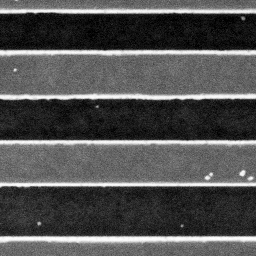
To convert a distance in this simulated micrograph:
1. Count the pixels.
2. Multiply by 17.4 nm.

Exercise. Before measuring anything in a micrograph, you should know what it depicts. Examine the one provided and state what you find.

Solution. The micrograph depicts lines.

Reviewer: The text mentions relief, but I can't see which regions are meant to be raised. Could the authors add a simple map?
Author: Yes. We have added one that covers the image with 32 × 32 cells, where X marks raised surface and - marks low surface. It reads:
XXXXXXXXXXXXXXXXXXXXXXXXXXXXXXXX
X-------XX-XXXXX-X-------XXXXXX-
--------------------------------
--------------------------------
--------------------------------
--------------------------------
XXXXXXXXXXXXXXXXXXXXXXXXXXXXXXXX
XXXXXXXXXXXXXXXXXXXXXXXXXXXXXXXX
XXXXXXXXXXXXXXXXXXXXXXXXXXXXXXXX
XXXXXXXXXXXXXXXXXXXXXXXXXXXXXXXX
XXXXXXXXXXXXXXXXXXXXXXXXXXXXXXXX
XXXXXXXXXXXXXXXXXXXXXXXXXXXXXXXX
--------------------------------
--------------------------------
--------------------------------
--------------------------------
--------------------------------
--------------------------------
XXXXXXXXXXXXXXXXXXXXXXXXXXXXXXXX
XXXXXXXXXXXXXXXXXXXXXXXXXXXXXXXX
XXXXXXXXXXXXXXXXXXXXXXXXXXXXXXXX
XXXXXXXXXXXXXXXXXXXXXXXXXXXXXXXX
XXXXXXXXXXXXXXXXXXXXXXXXXXXXXXXX
--------------------------------
--------------------------------
--------------------------------
--------------------------------
--------------------------------
--------------------------------
--------------------------------
XXXXXXXXXXXXXXXXXXXXXXXXXXXXXXXX
XXXXXXXXXXXXXXXXXXXXXXXXXXXXXXXX